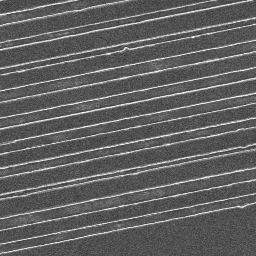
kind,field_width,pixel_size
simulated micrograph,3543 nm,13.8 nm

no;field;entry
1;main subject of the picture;parallel lines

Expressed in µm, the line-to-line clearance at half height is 0.132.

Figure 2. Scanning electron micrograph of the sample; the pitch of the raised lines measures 345 nm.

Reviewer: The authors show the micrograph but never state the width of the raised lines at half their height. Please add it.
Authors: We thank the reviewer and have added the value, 226 nm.